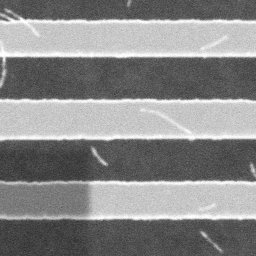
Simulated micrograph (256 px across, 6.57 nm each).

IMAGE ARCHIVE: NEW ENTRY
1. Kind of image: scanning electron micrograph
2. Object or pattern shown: lines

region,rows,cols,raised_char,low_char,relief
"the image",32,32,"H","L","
LLLLLLLLLLLLLLLLLLLLLLLLLLLLLLLL
LLLLLLLLLLLLLLLLLLLLLLLLLLLLLLLL
LLLLLLLLLLLLLLLLLLLLLLLLLLLLLLLL
HHHHHHHHHHHHHHHHHHHHHHHHHHHHHHHH
HHHHHHHHHHHHHHHHHHHHHHHHHHHHHHHH
HHHHHHHHHHHHHHHHHHHHHHHHHHHHHHHH
HHHHHHHHHHHHHHHHHHHHHHHHHHHHHHHH
LLLLLLLLLLLLLLLLLLLLLLLLLLLLLLLL
LLLLLLLLLLLLLLLLLLLLLLLLLLLLLLLL
LLLLLLLLLLLLLLLLLLLLLLLLLLLLLLLL
LLLLLLLLLLLLLLLLLLLLLLLLLLLLLLLL
LLLLLLLLLLLLLLLLLLLLLLLLLLLLLLLL
HLHHLHHLLLLHLLLHHHHLLLLLHLHLLHLL
HHHHHHHHHHHHHHHHHHHHHHHHHHHHHHHH
HHHHHHHHHHHHHHHHHHHHHHHHHHHHHHHH
HHHHHHHHHHHHHHHHHHHHHHHHHHHHHHHH
HHHHHHHHHHHHHHHHHHHHHHHHHHHHHHHH
LLLLLLLLLLLLLLLLLLLLLLLLLLLLLLLL
LLLLLLLLLLLLLLLLLLLLLLLLLLLLLLLL
LLLLLLLLLLLLLLLLLLLLLLLLLLLLLLLL
LLLLLLLLLLLLLLLLLLLLLLLLLLLLLLLL
LLLLLLLLLLLLLLLLLLLLLLLLLLLLLLLL
LLLLLLLLLLLLLLLLLLLLLLLLLLLLLLLL
HHHHHHHHHHHHHHHHHHHHHHHHHHHHHHHH
HHHHHHHHHHHHHHHHHHHHHHHHHHHHHHHH
HHHHHHHHHHHHHHHHHHHHHHHHHHHHHHHH
HHHHHHHHHHHHHHHHHHHHHHHHHHHHHHHH
LLLLLLLLLLLLLLLLLLLLLLLLLLLLLLLL
LLLLLLLLLLLLLLLLLLLLLLLLLLLLLLLL
LLLLLLLLLLLLLLLLLLLLLLLLLLLLLLLL
LLLLLLLLLLLLLLLLLLLLLLLLLLLLLLLL
LLLLLLLLLLLLLLLLLLLLLLLLLLLLLLLL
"